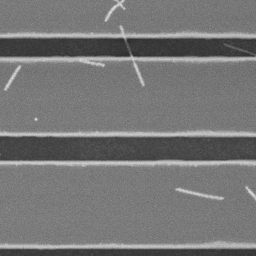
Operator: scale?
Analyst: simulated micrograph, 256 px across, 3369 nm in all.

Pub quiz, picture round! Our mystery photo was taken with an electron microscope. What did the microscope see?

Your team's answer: lines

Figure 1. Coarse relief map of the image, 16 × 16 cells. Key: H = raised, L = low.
HHHHHHHHHHHHHHHH
HHHHHHHHHHHHHHHH
LLLLLLLLLLLLLLLL
LLLLLLLLLLLLLLLL
HHHHHHHHHHHHHHHH
HHHHHHHHHHHHHHHH
HHHHHHHHHHHHHHHH
HHHHHHHHHHHHHHHH
LLLLLLLLLLLLLLLH
LLLLLLLLLLLLLLLL
HHHHHHHHHHHHHHHH
HHHHHHHHHHHHHHHH
HHHHHHHHHHHHHHHH
HHHHHHHHHHHHHHHH
HHHHHHHHHHHHHHHH
HHHHHHHHHHHHHHHH